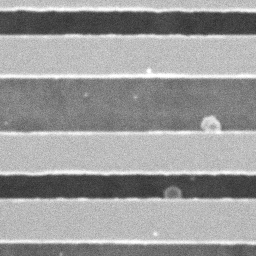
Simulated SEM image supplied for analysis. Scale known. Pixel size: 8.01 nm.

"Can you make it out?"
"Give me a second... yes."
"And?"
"lines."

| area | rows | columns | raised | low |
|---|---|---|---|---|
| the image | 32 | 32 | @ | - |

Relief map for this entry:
@@@@@@@@@@@@@@@@@@@@@@@@@@@@@@@@
--------------------------------
--------------------------------
--------------------------------
@@@@@@@@@@@@@@@@@@@@@@@@@@@@@@@@
@@@@@@@@@@@@@@@@@@@@@@@@@@@@@@@@
@@@@@@@@@@@@@@@@@@@@@@@@@@@@@@@@
@@@@@@@@@@@@@@@@@@@@@@@@@@@@@@@@
@@@@@@@@@@@@@@@@@@@@@@@@@@@@@@@@
@@@@@@@@@@@@@@@@@@@@@@@@@@@@@@@@
--------------------------------
--------------------------------
--------------------------------
--------------------------------
--------------------------------
--------------------------------
--------------------------------
@@@@@@@@@@@@@@@@@@@@@@@@@@@@@@@@
@@@@@@@@@@@@@@@@@@@@@@@@@@@@@@@@
@@@@@@@@@@@@@@@@@@@@@@@@@@@@@@@@
@@@@@@@@@@@@@@@@@@@@@@@@@@@@@@@@
@@@@@@@@@@@@@@@@@@@@@@@@@@@@@@@@
--------------------------------
--------------------------------
--------------------------------
@@@@@@@@@@@@@@@@@@@@@@@@@@@@@@@@
@@@@@@@@@@@@@@@@@@@@@@@@@@@@@@@@
@@@@@@@@@@@@@@@@@@@@@@@@@@@@@@@@
@@@@@@@@@@@@@@@@@@@@@@@@@@@@@@@@
@@@@@@@@@@@@@@@@@@@@@@@@@@@@@@@@
--------------------------------
--------------------------------